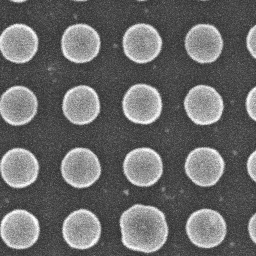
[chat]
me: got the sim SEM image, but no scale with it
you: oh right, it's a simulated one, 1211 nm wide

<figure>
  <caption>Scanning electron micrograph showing a regular array of raised bodies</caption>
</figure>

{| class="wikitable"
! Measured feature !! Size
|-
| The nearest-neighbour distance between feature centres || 290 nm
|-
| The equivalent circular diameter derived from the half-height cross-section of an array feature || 179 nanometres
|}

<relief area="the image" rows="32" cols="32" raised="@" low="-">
--------------------------------
--------------------------------
--------------------------------
-@@@-----@@-----@@@-----@@@-----
@@@@----@@@@----@@@@---@@@@----@
@@@@@---@@@@---@@@@@---@@@@@---@
@@@@----@@@@----@@@@---@@@@@---@
-@@@-----@@------@@-----@@@-----
--------------------------------
--------------------------------
--------------------------------
-@@@-----@@@----@@@-----@@@----@
@@@@----@@@@---@@@@@---@@@@@---@
@@@@@---@@@@---@@@@@---@@@@@---@
@@@@----@@@@----@@@@----@@@----@
----------@--------------@------
--------------------------------
--------------------------------
--------------------------------
-@@@----@@@@----@@@@----@@@----@
@@@@@---@@@@----@@@@---@@@@@---@
@@@@@---@@@@@---@@@@---@@@@@---@
-@@@----@@@@----@@@@----@@@-----
--------------------------------
--------------------------------
--------------------------------
--@------@@-----@@@@-----@@-----
@@@@----@@@@---@@@@@@---@@@@---@
@@@@@---@@@@---@@@@@@--@@@@@---@
@@@@@---@@@@---@@@@@@---@@@@---@
-@@@-----@@@----@@@@----@@@-----
--------------------------------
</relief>